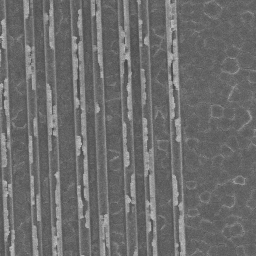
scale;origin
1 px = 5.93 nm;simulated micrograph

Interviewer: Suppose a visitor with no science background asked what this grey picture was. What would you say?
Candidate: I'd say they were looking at parallel lines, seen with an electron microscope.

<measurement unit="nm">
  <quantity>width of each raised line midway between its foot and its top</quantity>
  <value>57.1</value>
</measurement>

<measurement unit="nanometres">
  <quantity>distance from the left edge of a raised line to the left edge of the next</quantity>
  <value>142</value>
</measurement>